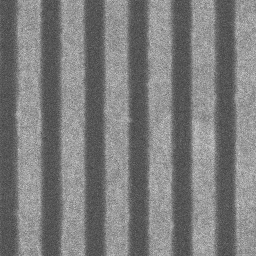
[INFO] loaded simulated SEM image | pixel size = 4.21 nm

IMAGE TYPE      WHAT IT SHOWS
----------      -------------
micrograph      parallel lines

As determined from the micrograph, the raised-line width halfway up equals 107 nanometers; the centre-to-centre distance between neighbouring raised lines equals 43.7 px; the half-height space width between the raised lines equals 75.3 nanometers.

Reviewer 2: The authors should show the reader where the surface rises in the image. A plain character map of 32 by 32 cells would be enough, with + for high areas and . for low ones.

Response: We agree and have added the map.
..+++...+++..+++..++++..+++..+++
..+++...+++..+++..++++..+++..+++
..+++...++...+++..++++..+++..+++
..+++...+++..+++..++++..+++..+++
..+++...+++..+++..++++..+++..+++
..+++...+++..+++..++++..+++..+++
..+++...+++..+++..++++..+++..+++
..+++...+++..+++..++++..+++...++
..+++...+++..+++...+++..+++..+++
..+++...+++..+++...+++..+++..+++
..+++...+++..+++..++++..+++..+++
..+++...+++..+++..++++..+++..+++
..+++...+++..+++..++++..+++..+++
..+++...+++..+++...+++..+++..+++
..+++...+++..+++...+++..+++..+++
..+++...+++..+++...+++..+++..+++
..+++...+++..+++...+++..+++..+++
..+++...+++..+++...+++..+++..+++
..+++...+++..+++..++++..+++..+++
..+++...+++..+++...+++..+++..+++
..+++...+++..+++...+++..+++..+++
..+++...+++..+++...+++..+++..+++
..+++...+++..+++...+++..+++..+++
..+++...+++..+++...+++..+++..+++
..+++...+++..+++...+++..+++..+++
..+++...+++..+++...+++..+++..+++
..+++...+++..+++...+++..+++..+++
..+++...+++..+++...+++..+++..+++
..+++...+++..+++...+++..+++..+++
..+++...+++..+++...+++..+++...++
..+++...+++..+++...+++..+++...++
..+++...+++..+++...+++..+++...++